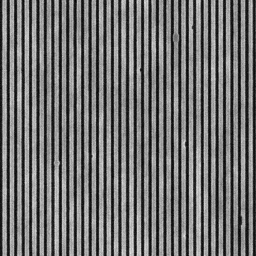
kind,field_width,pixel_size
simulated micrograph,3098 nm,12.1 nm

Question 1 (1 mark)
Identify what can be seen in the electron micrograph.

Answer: parallel lines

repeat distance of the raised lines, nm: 90.2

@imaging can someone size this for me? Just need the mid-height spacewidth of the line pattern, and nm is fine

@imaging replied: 46.9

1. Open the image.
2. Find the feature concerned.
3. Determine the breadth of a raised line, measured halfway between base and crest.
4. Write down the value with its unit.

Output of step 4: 46.9 nanometres